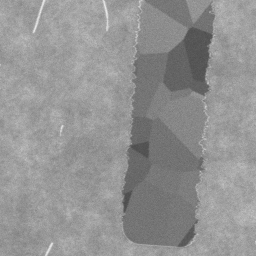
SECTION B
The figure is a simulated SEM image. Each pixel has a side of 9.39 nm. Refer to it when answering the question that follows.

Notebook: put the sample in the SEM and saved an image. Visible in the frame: one or a few lines or trenches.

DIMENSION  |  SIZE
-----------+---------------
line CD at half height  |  699 nm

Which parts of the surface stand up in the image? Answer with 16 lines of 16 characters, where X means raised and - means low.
---------XXXX---
---------XXXX---
--------XXXXX---
--------XXXXX---
--------XXXXX---
--------XXXXX---
--------XXXXX---
--------XXXXX---
--------XXXXX---
--------XXXXX---
--------XXXXX---
--------XXXX----
--------XXXX----
--------XXXX----
--------XXXX----
----------------